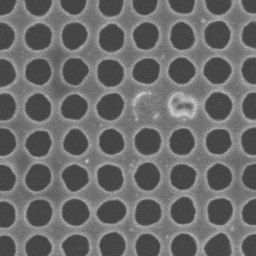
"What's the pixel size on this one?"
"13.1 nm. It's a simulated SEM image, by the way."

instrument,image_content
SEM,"a regular array of holes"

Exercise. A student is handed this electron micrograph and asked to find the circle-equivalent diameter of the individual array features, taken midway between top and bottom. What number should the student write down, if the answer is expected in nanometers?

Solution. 348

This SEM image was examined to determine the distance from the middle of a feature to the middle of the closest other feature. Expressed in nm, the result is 452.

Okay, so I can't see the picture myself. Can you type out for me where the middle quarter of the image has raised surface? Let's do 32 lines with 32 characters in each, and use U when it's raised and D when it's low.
DDDDDDUUUDDDDDUUUUDDDDDDUUUDDDDD
DDDDDDUUDDDDDDDUUDDDDDDDUUDDDDDD
DDDDDDUUDDDDDDDUUDDDDDDDUUDDDDDD
DDDDDUUUUDDDDDDUUUDDDDDUUUUDDDDD
UDDDDUUUUDDDDDUUUUDDDDDUUUUUDDDU
UUUUUUUUUUDDDUUUUUUUUUUUUUUUUUUU
UUUUUUUUUUUUUUUUUUUUUUUUUUUUUUUU
UUUUUUUUUUUDDDUUUUUUUUUUUUUUUUUU
UDDDDUUUUDDDDDUUUUUUUUUUUUUUUUUU
DDDDDDUUUDDDDDDUUUUUUUUUUUUUUUUU
DDDDDDUUDDDDDDDUUUUUUUUUUUUUUUUU
DDDDDDUUDDDDDDDUUUUUUUUUUUUUUUUU
DDDDDUUUUDDDDDUUUUUUUUUUUUUUUUUU
UDDDUUUUUUDDDUUUUUUUUUUUUUUUUUUU
UUUUUUUUUUUUUUUUUUUUUUUUUUUUUUUU
UUUUUUUUUUUUUUUUUUUUUUUUUUUUUUUU
UUDDUUUUUUUDDUUUUUUDDDDUUUUUDDDU
UDDDDUUUUDDDDDUUUUDDDDDDUUUDDDDD
DDDDDDUUUDDDDDDUUUDDDDDDUUDDDDDD
DDDDDDUUUDDDDDDUUUDDDDDDUUDDDDDD
DDDDDDUUUDDDDDDUUUDDDDDDUUDDDDDD
DDDDDUUUUDDDDDDUUUDDDDDDUUUDDDDD
UUDDUUUUUUUDDUUUUUUUDDUUUUUUDDDU
UUUUUUUUUUUUUUUUUUUUUUUUUUUUUUUU
UUUUUUUUUUUUUUUUUUUUUUUUUUUUUUUU
UDDDUUUUUUDDDUUUUUUDDDDUUUUDDDDU
DDDDDUUUUDDDDDUUUUDDDDDDUUUDDDDD
DDDDDDUUDDDDDDDUUUDDDDDDUUUDDDDD
DDDDDDUUDDDDDDDUUUDDDDDDUUUDDDDD
DDDDDDUUDDDDDDDUUUDDDDDDUUUDDDDD
DDDDDDUUUDDDDDDUUUDDDDDUUUUDDDDD
UDDDUUUUUUDDDUUUUUUUDDUUUUUUUDUU